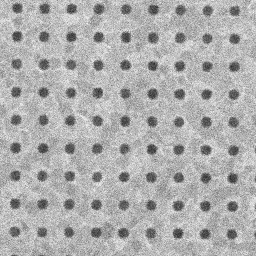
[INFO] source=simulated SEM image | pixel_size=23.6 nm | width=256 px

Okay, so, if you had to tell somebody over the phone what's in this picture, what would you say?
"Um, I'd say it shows a regular array of holes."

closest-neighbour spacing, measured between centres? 0.639 um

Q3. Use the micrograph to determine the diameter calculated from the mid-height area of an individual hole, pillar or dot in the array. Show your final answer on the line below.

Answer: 279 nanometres